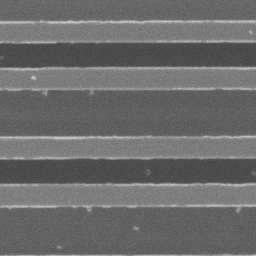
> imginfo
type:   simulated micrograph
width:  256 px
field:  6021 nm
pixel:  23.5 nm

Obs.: lines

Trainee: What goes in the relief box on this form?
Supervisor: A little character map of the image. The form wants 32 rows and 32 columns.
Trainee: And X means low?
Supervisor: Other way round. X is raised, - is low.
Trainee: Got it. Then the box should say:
--------------------------------
--------------------------------
--------------------------------
XXXXXXXXXXXXXXXXXXXXXXXXXXXXXXXX
XXXXXXXXXXXXXXXXXXXXXXXXXXXXXXXX
--------------------------------
--------------------------------
--------------------------------
-----XXXXXXXXXXXXXXXXXXXXXXXXXXX
XXXXXXXXXXXXXXXXXXXXXXXXXXXXXXXX
XXXXXXXXXXXXXXXXXXXXXXXXXXXXXXXX
--------------------------------
--------------------------------
--------------------------------
--------------------------------
--------------------------------
--------------------------------
XXXXXXXXXXXXXXXXXXXXXXXXXXXXXXXX
XXXXXXXXXXXXXXXXXXXXXXXXXXXXXXXX
XXXXXXXXXXXXXXXXXXXXXXXXXXXXXXXX
--------------------------------
--------------------------------
--------------------------------
XXXXXXXXXXXXXXXXXXXXXXXXXXXXXXXX
XXXXXXXXXXXXXXXXXXXXXXXXXXXXXXXX
XXXXXXXXXXXXXXXXXXXXXXXXXXXXXXXX
--------------------------------
--------------------------------
--------------------------------
--------------------------------
--------------------------------
--------------------------------